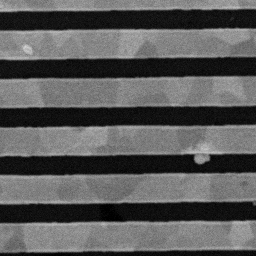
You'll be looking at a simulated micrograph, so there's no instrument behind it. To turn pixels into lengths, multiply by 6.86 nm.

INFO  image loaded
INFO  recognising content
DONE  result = lines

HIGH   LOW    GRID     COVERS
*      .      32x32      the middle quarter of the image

................................
................................
................................
............................****
********************************
********************************
********************************
********************************
********************************
********************************
................................
................................
................................
................................
................................
................................
********************************
********************************
********************************
********************************
********************************
********************************
**************..................
................................
................................
................................
................................
................................
********************************
********************************
********************************
********************************